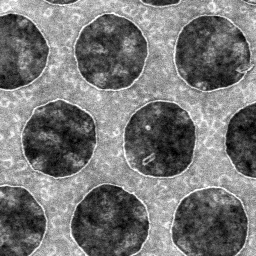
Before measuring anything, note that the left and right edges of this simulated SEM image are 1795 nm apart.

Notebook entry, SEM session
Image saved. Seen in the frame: raised bodies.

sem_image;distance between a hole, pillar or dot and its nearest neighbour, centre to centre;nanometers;704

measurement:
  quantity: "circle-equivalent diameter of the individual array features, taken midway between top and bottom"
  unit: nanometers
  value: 534